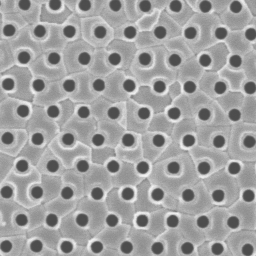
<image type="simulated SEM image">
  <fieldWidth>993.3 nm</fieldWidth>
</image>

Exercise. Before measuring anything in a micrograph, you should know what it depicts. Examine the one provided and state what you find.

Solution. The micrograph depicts a regular array of holes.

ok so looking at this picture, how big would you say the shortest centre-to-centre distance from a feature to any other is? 117 nm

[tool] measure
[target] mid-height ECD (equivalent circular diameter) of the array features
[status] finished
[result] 0.0458 microns